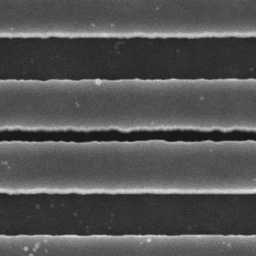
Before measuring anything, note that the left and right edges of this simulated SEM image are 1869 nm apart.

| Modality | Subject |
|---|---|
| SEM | lines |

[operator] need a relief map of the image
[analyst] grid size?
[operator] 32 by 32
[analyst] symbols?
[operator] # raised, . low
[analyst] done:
################################
################################
################################
################################
################################
................................
................................
................................
................................
................................
################################
################################
################################
################################
################################
################################
..........#....##........#..#..#
................................
################################
################################
################################
################################
################################
################################
................................
................................
................................
................................
................................
#.########.###.######.##########
################################
################################